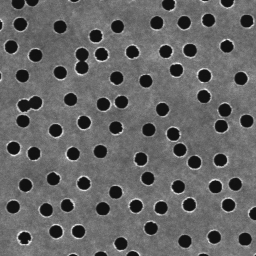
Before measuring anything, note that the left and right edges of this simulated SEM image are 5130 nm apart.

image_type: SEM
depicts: a regular array of holes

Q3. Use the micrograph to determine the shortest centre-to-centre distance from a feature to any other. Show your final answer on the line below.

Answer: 488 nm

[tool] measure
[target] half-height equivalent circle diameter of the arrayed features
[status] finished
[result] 0.266 µm